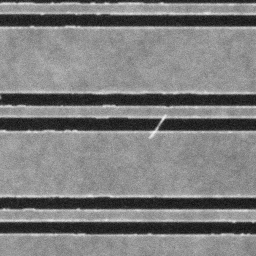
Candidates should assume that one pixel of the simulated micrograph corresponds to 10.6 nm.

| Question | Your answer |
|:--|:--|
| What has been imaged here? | lines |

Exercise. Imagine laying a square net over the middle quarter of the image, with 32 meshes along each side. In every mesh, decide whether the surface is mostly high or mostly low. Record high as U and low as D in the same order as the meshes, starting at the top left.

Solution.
UUUUUUUUUUUUUUUUUUUUUUUUUUUUUUUU
UUUUUUUUUUUUUUUUUUUUUUUUUUUUUUUU
UUUUUUUUUUUUUUUUUUUUUUUUUUUUUUUU
UUUUUUUUUUUUUUUUUUUUUUUUUUUUUUUU
UUUUUUUUUUUUUUUUUUUUUUUUUUUUUUUU
UUUUUUUUUUUUUUUUUUUUUUUUUUUUUUUU
UUUUUUUUUUUUUUUUUUUUUUUUUUUUUUUU
DDDDDDDDDDDDDDDDDDDDDDDDDDDDDDDD
DDDDDDDDDDDDDDDDDDDDDDDDDDDDDDDD
DDDDDDDDDDDDDDDDDDDDDDDDDDDDDDDD
DDDDDDDDDDUUUDDDDDDDDDDDDDDDDDDD
UUUUUUUUUUUUUUUUUUUUUUUUUUUUUUUU
UUUUUUUUUUUUUUUUUUUUUUUUUUUUUUUU
DDDDDDDDDDDDDDDDDDDDDDDDUDDDDDDD
DDDDDDDDDDDDDDDDDDDDDDDDDDDDDDDD
DDDDDDDDDDDDDDDDDDDDDDDDDDDDDDDD
DDDDDDDDDDDDDDDDDDDDDDDDDDDDDDDD
UUUUUUUUUUUUUUUUUUUUUUUUUUUUUUUU
UUUUUUUUUUUUUUUUUUUUUUUUUUUUUUUU
UUUUUUUUUUUUUUUUUUUUUUUUUUUUUUUU
UUUUUUUUUUUUUUUUUUUUUUUUUUUUUUUU
UUUUUUUUUUUUUUUUUUUUUUUUUUUUUUUU
UUUUUUUUUUUUUUUUUUUUUUUUUUUUUUUU
UUUUUUUUUUUUUUUUUUUUUUUUUUUUUUUU
UUUUUUUUUUUUUUUUUUUUUUUUUUUUUUUU
UUUUUUUUUUUUUUUUUUUUUUUUUUUUUUUU
UUUUUUUUUUUUUUUUUUUUUUUUUUUUUUUU
UUUUUUUUUUUUUUUUUUUUUUUUUUUUUUUU
UUUUUUUUUUUUUUUUUUUUUUUUUUUUUUUU
UUUUUUUUUUUUUUUUUUUUUUUUUUUUUUUU
UUUUUUUUUUUUUUUUUUUUUUUUUUUUUUUU
UUUUUUUUUUUUUUUUUUUUUUUUUUUUUUUU